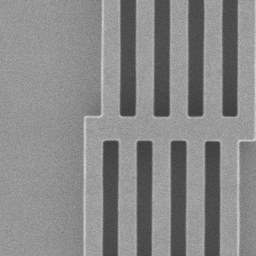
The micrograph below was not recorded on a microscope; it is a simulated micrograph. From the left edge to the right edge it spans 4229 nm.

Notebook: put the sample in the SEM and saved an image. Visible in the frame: groups of lines, slits or small figures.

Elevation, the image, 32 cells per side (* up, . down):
.............**..**..***..**..**
.............**..**..***..**..**
.............**..**..**...**..**
.............**..**..**...**..**
.............**..**..**...**..**
.............**..**..***..**..**
.............**..**..***..**..**
.............**..**..***..**..**
.............**..**..***.***..**
.............**..**..**..***..**
.............**..**..**..***..**
.............**..**..**..***..**
.............**..**..**..***..**
.............**..**..**..***..**
............***..***.***.***.***
...........*********************
...........*********************
...........**.******************
...........**..**..**..***..**..
...........**..**..**..***..**..
...........**..**..**..***..**..
...........**..**..**..***..**..
...........**..**..**..***..**..
...........**..**..**..***..**..
...........**..**..**..***..**..
...........**..**..**..**...**..
...........**..**..**..***..**..
...........**..**..**..***..**..
...........**..**..**..***..**..
...........**..**..**..**...**..
...........**..**..**..**...**..
...........**..**..**..**...**..